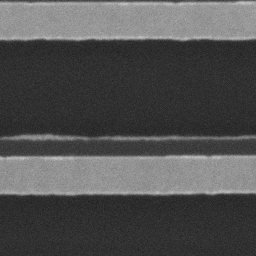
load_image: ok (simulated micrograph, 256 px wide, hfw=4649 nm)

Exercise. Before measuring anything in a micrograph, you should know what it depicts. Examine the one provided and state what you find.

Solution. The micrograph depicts lines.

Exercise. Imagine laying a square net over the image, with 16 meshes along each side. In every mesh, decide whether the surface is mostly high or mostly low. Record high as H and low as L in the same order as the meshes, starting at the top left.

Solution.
HHHHHHHHHHHHHHHH
HHHHHHHHHHHHHHHH
LLLLLLLLLLLHLLLL
LLLLLLLLLLLLLLLL
LLLLLLLLLLLLLLLL
LLLLLLLLLLLLLLLL
LLLLLLLLLLLLLLLL
LLLLLLLLLLLLLLLL
LLLLLLLLLLLLLLLL
HHHHHHHHHHHHHHHH
HHHHHHHHHHHHHHHH
HHHHHHHHHHHHHHHH
LLLLLLLLLLLLLLLL
LLLLLLLLLLLLLLLL
LLLLLLLLLLLLLLLL
LLLLLLLLLLLLLLLL